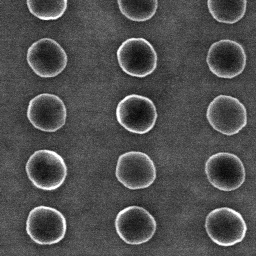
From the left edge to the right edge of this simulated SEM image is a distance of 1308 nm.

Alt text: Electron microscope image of a regular array of raised bodies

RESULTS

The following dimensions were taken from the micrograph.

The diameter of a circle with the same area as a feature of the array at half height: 197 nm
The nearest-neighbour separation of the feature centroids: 0.283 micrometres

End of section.